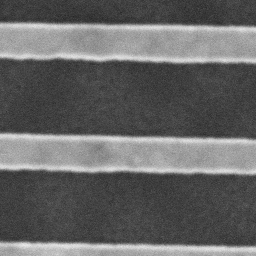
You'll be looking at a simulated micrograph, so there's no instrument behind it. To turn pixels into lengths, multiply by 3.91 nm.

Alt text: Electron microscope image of lines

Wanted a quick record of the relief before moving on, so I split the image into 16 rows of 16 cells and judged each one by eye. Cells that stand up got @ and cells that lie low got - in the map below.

----------------
@@@-------------
@@@@@@@@@@@@@@@@
@@@@@@@@@@@@@@@@
----------------
----------------
----------------
----------------
@@@-------------
@@@@@@@@@@@@@@@@
@@@@@@@@@@@@@@@@
----------------
----------------
----------------
----------------
@@@@@@@@@@@@@@@@